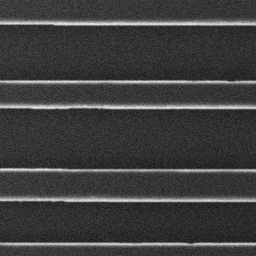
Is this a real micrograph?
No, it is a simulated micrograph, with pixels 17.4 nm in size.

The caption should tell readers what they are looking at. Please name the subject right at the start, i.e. lines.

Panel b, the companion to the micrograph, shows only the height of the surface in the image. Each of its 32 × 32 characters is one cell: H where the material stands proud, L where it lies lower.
HHHHHHHHHHHHHHHHHHHHHHHHHHHHHHHH
HHHHHHHHHHHHHHHHHHHHHHHHHHHHHHHH
HHHHHHHHHHHHHHHHHHHHHHHHHHHHHHHH
LLLLLLLLLLLLLLLLLLLLLLLLLLLLLLLL
LLLLLLLLLLLLLLLLLLLLLLLLLLLLLLLL
LLLLLLLLLLLLLLLLLLLLLLLLLLLLLLLL
LLLLLLLLLLLLLLLLLLLLLLLLLLLLLLLL
LLLLLLLLLLLLLLLLLLLLLLLLLLLLLLLL
LLLLLLLLLLLLLLLLLLLLLLLLLLLLLLLL
LLLLLLLLLLLLLLLLLLLLLLLLLLLLLLLL
HHHHHHHHHHHHHHHHHHHHHHHHHHHHHHHH
HHHHHHHHHHHHHHHHHHHHHHHHHHHHHHHH
HHHHHHHHHHHHHHHHHHHHHHHHHHHHHHHH
LLLLLLLLLLLLLLLLLLLLLLLLLLLLLLLL
LLLLLLLLLLLLLLLLLLLLLLLLLLLLLLLL
LLLLLLLLLLLLLLLLLLLLLLLLLLLLLLLL
LLLLLLLLLLLLLLLLLLLLLLLLLLLLLLLL
LLLLLLLLLLLLLLLLLLLLLLLLLLLLLLLL
LLLLLLLLLLLLLLLLLLLLLLLLLLLLLLLL
LLLLLLLLLLLLLLLLLLLLLLLLLLLLLLLL
LLLLLLLLLLLLLLLLLLLLLLLLLLLLLLLL
HHHHHHHHHHHHHHHHHHHHHHHHHHHHHHHH
HHHHHHHHHHHHHHHHHHHHHHHHHHHHHHHH
HHHHHHHHHHHHHHHHHHHHHHHHHHHHHHHH
HHHHHHHHHHHHHHHHHHHHHHHHHHHHHHHH
LLLLLLLLLLLLLLLLLLLLLLLLLLLLLLLL
LLLLLLLLLLLLLLLLLLLLLLLLLLLLLLLL
LLLLLLLLLLLLLLLLLLLLLLLLLLLLLLLL
LLLLLLLLLLLLLLLLLLLLLLLLLLLLLLLL
LLLLLLLLLLLLLLLLLLLLLLLLLLLLLLLL
HHHHHHHHHHHHHHLLLLHHLHLLLLLLLLLL
HHHHHHHHHHHHHHHHHHHHHHHHHHHHHHHH